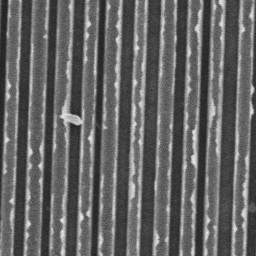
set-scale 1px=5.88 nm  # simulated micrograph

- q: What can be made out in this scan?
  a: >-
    parallel lines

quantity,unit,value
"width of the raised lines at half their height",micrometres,0.0875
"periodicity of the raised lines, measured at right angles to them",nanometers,152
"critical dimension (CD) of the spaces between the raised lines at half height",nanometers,66.1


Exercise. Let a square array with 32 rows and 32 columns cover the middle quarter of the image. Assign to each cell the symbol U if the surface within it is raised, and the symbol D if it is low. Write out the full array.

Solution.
UUDDDUUUDDUUUUDDDUUUDDDDUUUUDDDU
UUDDDUUUDDUUUUDDDUUUDDDDUUUUDDDU
UUDDDUUUDDUUUUDDDUUUDDDDUUUDDDDU
UDDDDUUUDDUUUUDDDUUUDDDDUUUUDDUU
UDDDDUUUDDUUUUDDDUUUDDDDUUUDDDUU
UDDDDUUUDDUUUUDDDUUUDDDDUUUDDDUU
UDDDDUUUDDUUUUDDDUUUDDDDUUUDDDUU
UDDDDUUUDDUUUUDDDUUUDDDDUUUDDDUU
UDDDDUUUDDUUUDDDDUUUDDDDUUUDDDUU
UDDDDUUUDDUUUDDDDUUUDDDDUUUDDDUU
UDDDDUUUDDUUUDDDDUUUDDDDUUUDDDUU
UDDDUUUUDDUUUDDDDUUUDDDDUUUDDDUU
UUDDDUUUDDUUUDDDDUUUDDDDUUUDDDUU
UUUUDUUUDDUUUDDDDUUUDDDDUUUDDDUU
UUUUUUUUDDUUUDDDDUUUDDDDUUUDDDUU
UDDDDUUUDDUUUDDDDUUUDDDDUUUDDDUU
UDDDUUUUDDUUUDDDDUUUDDDUUUUDDDUU
UDDDUUUUDDUUUDDDDUUUDDDUUUUDDDUU
UDDDUUUUDDUUUDDDDUUUDDDUUUUDDDUU
UDDDUUUDDDUUUDDDDUUUDDDUUUUDDDUU
UDDDUUUDDDUUUDDDDUUUDDDUUUUDDDUU
UDDDUUUDDDUUUDDDDUUUDDDUUUUDDDUU
UDDDUUUDDUUUUDDDUUUUDDDUUUUDDDUU
UDDDUUUDDUUUUDDDUUUUDDDUUUUDDDUU
UDDDUUUDDUUUUDDDDUUDDDDUUUUDDDUU
UDDDUUUDDUUUUDDDDUUDDDDUUUUDDDUU
UDDDUUUDDUUUUDDDDUUDDDDUUUUDDDUU
UDDDUUUDDUUUUDDDDUUDDDDUUUUDDDUU
UDDDUUUDDUUUUDDDDUUDDDDUUUUDDDUU
UDDDUUUDDUUUUDDDUUUDDDDUUUUDDDUU
UDDDUUUDDUUUUDDDUUUDDDDUUUUDDDUU
UDDDUUUDDUUUUDDDUUUDDDDUUUDDDDUU